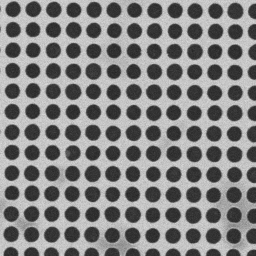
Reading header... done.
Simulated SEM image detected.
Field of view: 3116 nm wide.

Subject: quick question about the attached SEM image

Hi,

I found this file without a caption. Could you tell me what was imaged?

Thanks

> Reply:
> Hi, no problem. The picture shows a regular array of holes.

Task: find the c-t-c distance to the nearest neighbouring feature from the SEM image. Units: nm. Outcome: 243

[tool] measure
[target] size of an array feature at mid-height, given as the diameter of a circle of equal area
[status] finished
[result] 15.7 px